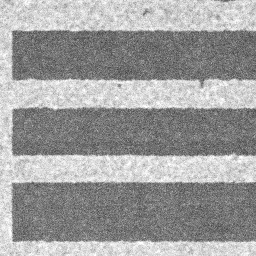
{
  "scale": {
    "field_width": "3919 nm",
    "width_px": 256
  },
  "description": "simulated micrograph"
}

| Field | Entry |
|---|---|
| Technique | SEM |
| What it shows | one or a few lines or trenches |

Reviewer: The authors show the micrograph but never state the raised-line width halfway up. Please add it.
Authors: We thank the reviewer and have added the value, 383 nanometres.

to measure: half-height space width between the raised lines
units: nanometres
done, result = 777